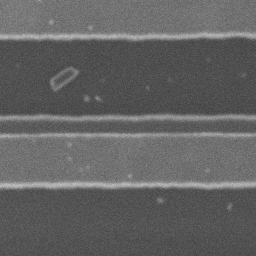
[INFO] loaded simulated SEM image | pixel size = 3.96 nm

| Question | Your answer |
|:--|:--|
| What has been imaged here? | lines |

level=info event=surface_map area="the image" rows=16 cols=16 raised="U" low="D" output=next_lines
UUUUUUUUUUUUUUUU
UUUUUUUUUUUUUUUU
DDDDDDDDDDDDDDDD
DDDDDDDDDDDDDDDD
DDDDDDDDDDDDDDDD
DDDDDDDDDDDDDDDD
DDDDDDDDDDDDDDDD
DDDDDDDDDDDDDDDD
UUUUUUUUUUUUUUUU
UUUUUUUUUUUUUUUU
UUUUUUUUUUUUUUUU
UUUUUUUUUUUUUUUD
DDDDDDDDDDDDDDDD
DDDDDDDDDDDDDDDD
DDDDDDDDDDDDDDDD
DDDDDDDDDDDDDDDD